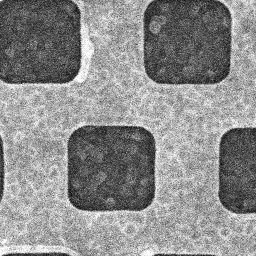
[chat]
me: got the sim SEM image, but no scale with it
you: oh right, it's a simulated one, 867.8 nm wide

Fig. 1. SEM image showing holes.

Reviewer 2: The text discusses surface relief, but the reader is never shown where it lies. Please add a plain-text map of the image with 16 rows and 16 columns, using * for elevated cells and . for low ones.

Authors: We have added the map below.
.....****.....**
.....****......*
.....****.....**
.....****.....**
.....****.....**
****************
****************
****************
****......****..
****......****..
****......****..
****......****..
****......****..
****************
****************
****************